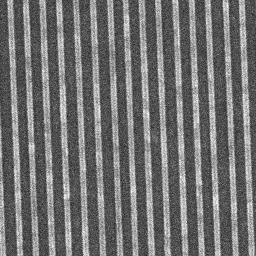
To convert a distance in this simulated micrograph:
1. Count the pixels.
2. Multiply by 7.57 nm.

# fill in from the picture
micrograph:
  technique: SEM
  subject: parallel lines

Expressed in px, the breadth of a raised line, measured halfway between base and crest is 4.74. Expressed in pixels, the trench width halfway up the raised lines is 11.2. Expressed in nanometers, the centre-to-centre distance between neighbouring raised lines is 125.